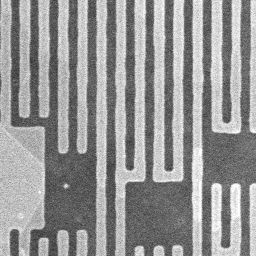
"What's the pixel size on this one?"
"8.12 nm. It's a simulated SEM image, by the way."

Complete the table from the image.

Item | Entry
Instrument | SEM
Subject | wiring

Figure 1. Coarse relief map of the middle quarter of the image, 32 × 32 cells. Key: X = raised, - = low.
X---XX--XX---XX---XX---XX--XXX--
X--XXX--XX---XX---XX---XX--XXX--
X--XXX--XX---XX---XX---XX--XXX--
X--XXX--XX---XX---XX---XX--XXX--
X--XXX--XX---XX---XX---XX---X---
X---X---XX---XX---XX---XX---XX--
X---X---XX---XX---XX---XX--XXX--
X---X---XX---XX---XX---XX--XXX--
X---X---XX---XX---XX---XX--XXX--
X---X---XX---XX---XX---XX--XXX--
X---X---XX---XX---XX---XX--XXX--
X---XX--XXX--XX---XX---XX--XXX--
X---XX--XXX--XX---XX---XX--XXX--
X---XX--XXX--XX---XX---XX--XXX--
X---XX--XXX--XX---XX---XX--XXX--
X---X---XXX--XX---XX---XX--XXX--
X---X---XX---XX---XX---XX--XXX--
X---X---XX---XX---XX---XX--XXX--
X--XX---XX---XX---XX---XX--XXX--
X--XX---XX---XX---XX---XX--XXX--
X--XX---XX---XX---XX---XX--XXX--
X---X---XX---XX---XX---XX--XXX--
--------XX---XX---XX---XX--XXX--
--------XX---XX---XX---XX--XXX--
--------XX---XX---XX---XX--XXX--
--------XX---XX---XX---XX--XXX--
--------XX---XXX-XXX--XXX--XXX--
--------XX---XXXXXXX--XXXXXXXX--
--------XX---XXXXXXX--XXXXXXXX--
--------XX---XXX----------------
X-------XX---XX-----------------
--------XX---XX-----------------